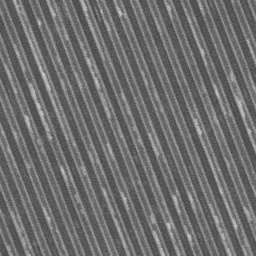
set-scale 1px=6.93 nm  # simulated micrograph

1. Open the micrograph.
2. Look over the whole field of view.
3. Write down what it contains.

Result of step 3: parallel lines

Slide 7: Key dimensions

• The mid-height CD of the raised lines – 47.7 nm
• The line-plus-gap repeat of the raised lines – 108 nm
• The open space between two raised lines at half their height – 60.6 nm